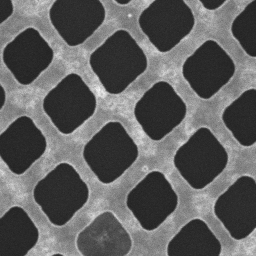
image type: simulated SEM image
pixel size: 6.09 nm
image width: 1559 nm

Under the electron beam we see a regular array of holes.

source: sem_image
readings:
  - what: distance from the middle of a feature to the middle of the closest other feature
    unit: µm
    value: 0.388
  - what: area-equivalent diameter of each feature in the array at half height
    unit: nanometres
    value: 316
